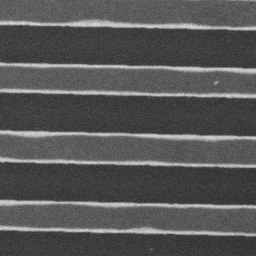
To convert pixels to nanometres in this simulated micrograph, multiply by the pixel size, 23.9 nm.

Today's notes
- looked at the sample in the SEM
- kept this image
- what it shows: lines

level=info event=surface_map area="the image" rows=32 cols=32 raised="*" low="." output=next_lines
********************************
********************************
********************************
..........................******
................................
................................
................................
................................
**********************..........
********************************
********************************
...*****************************
................................
................................
................................
................................
**..............................
********************************
********************************
********************************
.................*.*************
................................
................................
................................
................................
*************...................
********************************
********************************
********************************
................................
................................
................................